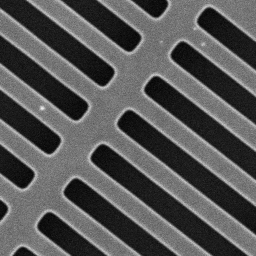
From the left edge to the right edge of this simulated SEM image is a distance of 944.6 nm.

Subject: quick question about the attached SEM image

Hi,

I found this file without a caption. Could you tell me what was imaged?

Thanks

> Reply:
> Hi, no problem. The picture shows groups of lines, slits or small figures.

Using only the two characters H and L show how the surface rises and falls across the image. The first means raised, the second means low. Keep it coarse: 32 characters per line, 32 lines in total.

LLLLHHHHLLLLLHHHHLLLLHHHHHHHHHHH
HLLLLHHHHLLLLLHHHHLLHHHHHLLHHHHH
HHLLLLHHHHHLLLLHHHHHHHHHHLLLHHHH
HHHLLLLLHHHHLLLLLHHHHHHHHLLLLLHH
HHHHLLLLLHHHHLLLLLHHHHHHHHLLLLLH
LHHHHHLLLLHHHHHLLHHHHHLHHHHHLLLL
LLLHHHHLLLLLHHHHHHHHHLLLLHHHHLLL
LLLLHHHHLLLLLHHHHHHHHHLLLLHHHHLL
HLLLLHHHHHLLLLHHHHHHHHHLLLLHHHHH
HHLLLLLHHHHLLLHHHHHHHHHHLLLLLHHH
HHHLLLLLHHHHLHHHHHLLLHHHHLLLLLHH
HHHHHLLLLHHHHHHHHHLLLLHHHHHLLLLH
LLHHHHLLLLLHHHHHHHHLLLLLHHHHLLLL
LLLHHHHLLLLHHHHHHHHHLLLLLHHHHLLL
LLLLHHHHLLHHHHHLLHHHHHLLLLHHHHLL
HLLLLLHHHHHHHHHLLLLHHHHLLLLLHHHH
HHLLLLLHHHHHHHHLLLLLHHHHLLLLLHHH
HHHLLLLLHHHHHHHHHLLLLHHHHHLLLLHH
LHHHHLLHHHHHLLHHHHLLLLLHHHHLLLLH
LLHHHHHHHHHLLLLHHHHLLLLLHHHHLLLL
LLLHHHHHHHHHLLLLHHHHHLLLLHHHHLLL
LLLLHHHHHHHHHLLLLLHHHHLLLLHHHHHL
HLLLHHHHHLHHHHLLLLLHHHHLLLLLHHHH
HHHHHHHHLLLHHHHHLLLLHHHHLLLLLHHH
HHHHHHHHLLLLLHHHHLLLLHHHHHLLLLHH
LHHHHHHHHLLLLLHHHHLLLLLHHHHLLLLL
LHHHHHHHHHHLLLLHHHHLLLLLHHHHLLLL
HHHHHLLLHHHHLLLLLHHHHLLLLHHHHHLL
HHHHHLLLLHHHHLLLLLHHHHLLLLLHHHHL
HHHHHHLLLLHHHHLLLLLHHHHLLLLLHHHH
HHHHHHHLLLLLHHHHLLLLHHHHHLLLLHHH
HHLLHHHHLLLLLHHHHLLLLLHHHHLLLLHH